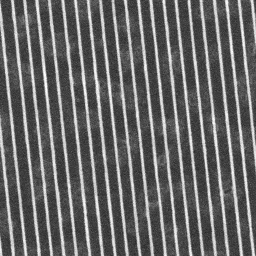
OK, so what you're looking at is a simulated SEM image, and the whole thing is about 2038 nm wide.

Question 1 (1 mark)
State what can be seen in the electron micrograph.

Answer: parallel lines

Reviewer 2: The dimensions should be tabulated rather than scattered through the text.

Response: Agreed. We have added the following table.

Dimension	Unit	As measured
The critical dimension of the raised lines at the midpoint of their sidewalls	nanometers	18.8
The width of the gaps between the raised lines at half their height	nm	81.1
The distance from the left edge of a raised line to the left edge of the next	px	12.6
